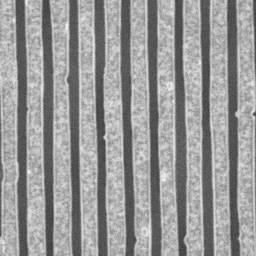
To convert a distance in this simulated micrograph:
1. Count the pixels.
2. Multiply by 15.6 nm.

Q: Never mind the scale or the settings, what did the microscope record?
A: parallel lines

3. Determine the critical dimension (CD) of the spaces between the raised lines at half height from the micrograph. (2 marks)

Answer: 167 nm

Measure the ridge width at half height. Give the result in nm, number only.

237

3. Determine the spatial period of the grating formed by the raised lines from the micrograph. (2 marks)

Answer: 410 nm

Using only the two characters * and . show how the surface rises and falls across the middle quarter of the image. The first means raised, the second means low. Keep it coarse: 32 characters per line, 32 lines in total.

*...***...****...****...***...**
*...***...****...****...***...**
*...****..****...****...***...**
*...****..****...****...***...**
*...****..****...****...***...**
*...****..****...****...***...**
*...****..****...****...***...**
*...****..****...****...****..**
*...****..****...****...****...*
*...****..****...****...****...*
*...****..****...****...****...*
*...****..****...****...****...*
*...****..****...****...***....*
*...****..****...****...***....*
*...****..****...****...***....*
*...****...***...****...***....*
*...****...***...****...***....*
*...****..****...****...***....*
*...****..****...****...***....*
*...****...****..****...***....*
*...****...****..****...***....*
*...****...****..****...***....*
*...****...****..****...****...*
*...****...****..****...****...*
*...****...****..****...****...*
*...****...****..****...****...*
*...****...****...***...****...*
*...****...****...***...****...*
**..****...****...***...****...*
**..****...****...***...****...*
**..****...****...***...****...*
**..****...****...***...****...*